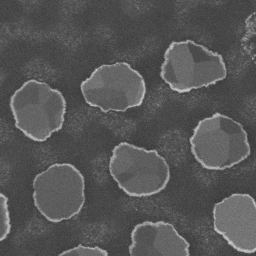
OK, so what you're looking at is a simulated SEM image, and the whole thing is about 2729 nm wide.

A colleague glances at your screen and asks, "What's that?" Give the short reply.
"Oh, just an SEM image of raised bodies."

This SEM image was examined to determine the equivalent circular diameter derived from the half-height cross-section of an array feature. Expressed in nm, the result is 580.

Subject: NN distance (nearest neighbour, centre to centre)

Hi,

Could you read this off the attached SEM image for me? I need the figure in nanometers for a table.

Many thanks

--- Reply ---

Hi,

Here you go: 858